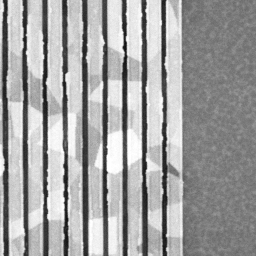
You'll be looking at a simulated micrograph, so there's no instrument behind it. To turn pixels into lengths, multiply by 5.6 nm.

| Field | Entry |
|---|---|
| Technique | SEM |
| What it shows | parallel lines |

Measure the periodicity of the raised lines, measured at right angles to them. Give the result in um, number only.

0.111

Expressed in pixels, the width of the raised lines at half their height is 14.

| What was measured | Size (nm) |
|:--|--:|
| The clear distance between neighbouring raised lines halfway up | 31.5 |